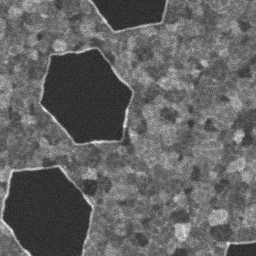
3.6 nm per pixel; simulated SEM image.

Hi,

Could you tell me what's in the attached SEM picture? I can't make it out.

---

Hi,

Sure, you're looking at holes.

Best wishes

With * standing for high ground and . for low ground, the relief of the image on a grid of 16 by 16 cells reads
******....******
*******...******
****************
***...**********
***....*********
***.....********
***.....********
***.....********
****....********
****************
***.************
*....***********
.....***********
......**********
*.....**********
*....*********..